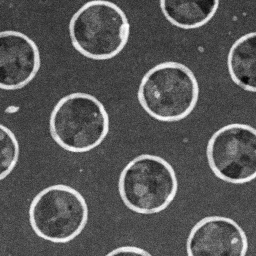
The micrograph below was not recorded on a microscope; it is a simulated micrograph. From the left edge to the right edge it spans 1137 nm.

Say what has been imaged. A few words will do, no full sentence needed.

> raised bodies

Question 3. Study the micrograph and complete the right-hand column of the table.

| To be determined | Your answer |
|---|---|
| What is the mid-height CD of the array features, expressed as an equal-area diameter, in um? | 0.243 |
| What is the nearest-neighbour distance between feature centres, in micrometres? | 0.412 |